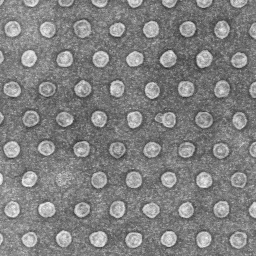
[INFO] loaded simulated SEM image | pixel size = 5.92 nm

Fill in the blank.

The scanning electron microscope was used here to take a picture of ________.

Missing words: a regular array of raised bodies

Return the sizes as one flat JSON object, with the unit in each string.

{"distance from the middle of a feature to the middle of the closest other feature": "200 nm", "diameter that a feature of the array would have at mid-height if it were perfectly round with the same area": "88.1 nanometers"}